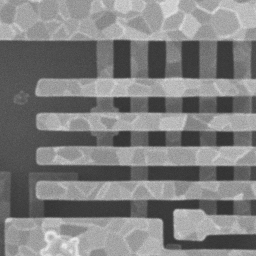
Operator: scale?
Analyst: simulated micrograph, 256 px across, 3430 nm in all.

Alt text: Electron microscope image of wiring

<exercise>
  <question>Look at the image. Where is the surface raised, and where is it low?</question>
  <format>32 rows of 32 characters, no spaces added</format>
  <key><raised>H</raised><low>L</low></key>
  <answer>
HHHHHHHHHHHHHHHHHHHHHHHHHHHHHHHH
HHHHHHHHHHHHHHHHHHHHHHHHHHHHHHHH
HHHHHHHHHHHHHHHHHHHHHHHHHHHHHHHH
HHHHHHHHHHHHHHHHHHHHHHHHHHHHHHHH
HHHHHHHHHHHHHHHHHHHHHHHHHHHHHHHH
LLLLLLLLLLLLLLLLLLLLLLLLLLLLLLLL
LLLLLLLLLLLLLLLLLLLLLLLLLLLLLLLL
LLLLLLLLLLLLLLLLLLLLLLLLLLLLLLLL
LLLLLLLLLLLLLLLLLLLLLLLLLLLLLLLL
LLLLLLLLLLLLLLLLLLLLLLLLLLLLLLLL
LLLLLHHHHHHHHHHHHHHHHHHHHHHHHHHH
LLLLLHHHHHHHHHHHHHHHHHHHHHHHHHHH
LLLLLLLLLLLLLLLLLLLLLLLLLLLLLLLL
LLLLLLLLLLLLLLLLLLLLLLLLLLLLLLLL
LLLLLHHHHHHHHHHHHHHHHHHHHHHHHHHH
LLLLLHHHHHHHHHHHHHHHHHHHHHHHHHHH
LLLLLLLLLLLLLLLLLLLLLLLLLLLLLLLL
LLLLLLLLLLLLLLLLLLLLLLLLLLLLLLLL
LLLLLHHHHHHHHHHHHHHHHHHHHHHHHHHH
LLLLLHHHHHHHHHHHHHHHHHHHHHHHHHHH
LLLLLHHHHHHHHHHHHHHHHHHHHHHHHHHH
LLLLLLLLLLLLLLLLLLLLLLLLLLLLLLLL
LLLLLLLLLLLLLLLLLLLLLLLLLLLLLLLL
LLLLLHHHHHHHHHHHHHHHHHHHHHHHHHHH
LLLLLHHHHHHHHHHHHHHHHHHHHHHHHHHH
LLLLLLLLLLLLLLLLLLLLLLLLLLLLLLLL
LLLLLLLLLLLLLLLLLLLLLLHHHLLLLLLL
LHHHHHHHHHHHHHHHHHHHLLHHHHHHHHHH
LHHHHHHHHHHHHHHHHHHHLLHHHHHHHHHH
LHHHHHHHHHHHHHHHHHHHLLHHHHLLLLLL
LHHHHHHHHHHHHHHHHHHHLLLLLLLLLLLL
LHHHHHHHHHHHHHHHHHHHHHHHHHHHHHHH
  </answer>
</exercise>